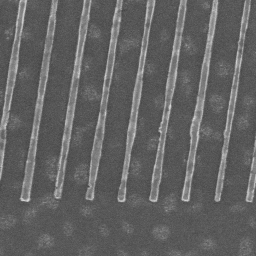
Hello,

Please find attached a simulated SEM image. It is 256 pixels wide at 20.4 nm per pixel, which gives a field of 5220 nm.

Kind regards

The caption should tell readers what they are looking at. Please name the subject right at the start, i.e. parallel lines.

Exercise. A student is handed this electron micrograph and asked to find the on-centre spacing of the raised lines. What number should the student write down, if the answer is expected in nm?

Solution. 647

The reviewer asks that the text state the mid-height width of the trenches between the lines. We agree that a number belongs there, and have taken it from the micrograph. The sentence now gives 536 nm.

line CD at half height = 116 nm